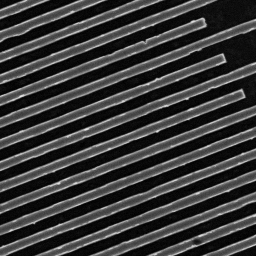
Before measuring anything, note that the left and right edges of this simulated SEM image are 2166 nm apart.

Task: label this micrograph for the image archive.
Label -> parallel lines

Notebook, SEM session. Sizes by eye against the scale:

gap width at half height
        91.7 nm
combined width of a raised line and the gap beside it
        171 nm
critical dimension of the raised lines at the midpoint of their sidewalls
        82.9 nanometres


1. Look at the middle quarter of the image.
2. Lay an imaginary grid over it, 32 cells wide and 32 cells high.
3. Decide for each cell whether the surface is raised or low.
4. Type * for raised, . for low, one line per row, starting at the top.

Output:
...*******........******........
.*******.......*******.......***
****.........******.......******
**........******........******..
.......*******.......******.....
.....******........******.......
..******........******........**
******.......******........*****
***........******........******.
*.......*******.......*******...
......******........******......
...******........******........*
*******.......*******........***
*****.......******........******
**........******.......******...
.......******.......*******.....
.....******.......******........
..******........******.......***
*****........******........*****
***.......******........*******.
.......*******........******....
.....******........*******......
...******.......*******........*
******........*******.......****
****.......*******.......*******
*........******........******...
......******........*******.....
...*******........******.......*
.******........******........***
*****.......*******.......******
**........******........******..
.......*******........*****.....